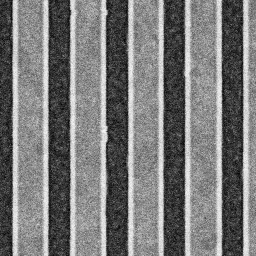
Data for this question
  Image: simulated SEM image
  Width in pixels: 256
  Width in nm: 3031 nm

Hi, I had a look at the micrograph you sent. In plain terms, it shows parallel lines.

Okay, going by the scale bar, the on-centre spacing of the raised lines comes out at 57.5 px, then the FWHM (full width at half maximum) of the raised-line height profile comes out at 358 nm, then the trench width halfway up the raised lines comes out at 323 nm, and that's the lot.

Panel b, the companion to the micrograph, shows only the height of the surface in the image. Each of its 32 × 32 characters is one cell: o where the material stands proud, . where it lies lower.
..oooo...oooo...oooo...oooo....o
..oooo...oooo...oooo...oooo....o
..oooo...oooo...oooo...oooo....o
..oooo...oooo...oooo...oooo....o
..oooo...oooo...oooo...oooo....o
..oooo...oooo...oooo...oooo....o
..oooo...oooo...oooo...oooo....o
..oooo...oooo...oooo...oooo....o
..oooo...oooo...oooo...oooo....o
..oooo...oooo...oooo...oooo....o
..oooo...oooo...oooo...oooo....o
..oooo...oooo...oooo...oooo....o
..oooo...oooo...oooo...oooo....o
..oooo...oooo...oooo...oooo....o
..oooo...oooo...oooo...oooo....o
..oooo...oooo...oooo...oooo....o
..oooo...oooo...oooo...oooo....o
..oooo...oooo...oooo...oooo....o
..oooo...oooo...oooo...oooo....o
..oooo...oooo...oooo...oooo....o
..oooo...oooo...oooo...oooo....o
..oooo...oooo...oooo...oooo....o
..oooo...oooo...oooo...oooo....o
..oooo...oooo...oooo...oooo....o
..oooo...oooo...oooo...oooo....o
..oooo...oooo...oooo...oooo....o
..oooo...oooo...oooo...oooo....o
..oooo...oooo...oooo...oooo....o
..oooo...oooo...oooo...oooo....o
..oooo...oooo...oooo...oooo....o
..oooo...oooo...oooo...oooo....o
..oooo...oooo...oooo...oooo....o